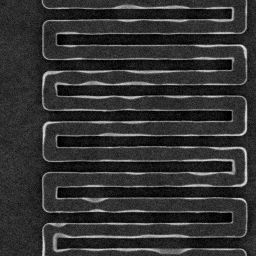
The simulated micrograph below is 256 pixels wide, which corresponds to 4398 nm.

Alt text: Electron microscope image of groups of lines, slits or small figures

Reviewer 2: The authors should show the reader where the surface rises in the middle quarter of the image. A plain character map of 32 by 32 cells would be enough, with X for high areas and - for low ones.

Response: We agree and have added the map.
--------------------------------
--------------------------------
XXXXXXXXXXXXXXXXXXXXXXXXXXXXXXXX
XXXXXXXXXXXXXXXXXXXXXXXXXXXXXXXX
XXXXXXXXXXXXXXXXXXXXXXXXXXXXXXXX
--------------------------------
--------------------------------
--------------------------------
XXXXXXXXXXXXXXXX-XXXXXXXXXXXXXXX
XXXXXXXXXXXXXXXXXXXXXXXXXXXXXXXX
XXXXXXXXXXXXXXXXXXXXXXXXXXXXXXXX
--------XXXXXX----------XXXX----
--------------------------------
--------------------------------
XXXXXXX------X-----XXXXXXXXXXXXX
XXXXXXXXXXXXXXXXXXXXXXXXXXXXXXXX
XXXXXXXXXXXXXXXXXXXXXXXXXXXXXXXX
XXXXXXXXXXXXXXXXXXXXXXXXXXXXXXXX
--------------------------------
--------------------------------
--------------------------------
XXXXXXXXXXXXXXXXXXXXXXXXXXXXXXXX
XXXXXXXXXXXXXXXXXXXXXXXXXXXXXXXX
XXXXXXXXXXXXXXXXXXXXXXXXXXXXXXXX
--------------------------------
--------------------------------
--------------------------------
XXXXXXXXXXXXXXXXXXXXXXXXXXXXXXXX
XXXXXXXXXXXXXXXXXXXXXXXXXXXXXXXX
XXXXXXXXXXXXXXXXXXXXXXXXXXXXXXXX
XXXXX-----X-XXXXXXXXXXXX---XXX--
--------------------------------